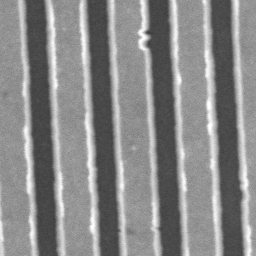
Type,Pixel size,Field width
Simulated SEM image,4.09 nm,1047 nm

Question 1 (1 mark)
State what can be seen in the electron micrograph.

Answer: parallel lines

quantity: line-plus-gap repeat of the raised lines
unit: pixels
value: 61.4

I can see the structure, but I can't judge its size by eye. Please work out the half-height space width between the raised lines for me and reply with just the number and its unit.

100 nanometres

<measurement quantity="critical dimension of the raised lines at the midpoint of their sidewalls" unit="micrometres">0.151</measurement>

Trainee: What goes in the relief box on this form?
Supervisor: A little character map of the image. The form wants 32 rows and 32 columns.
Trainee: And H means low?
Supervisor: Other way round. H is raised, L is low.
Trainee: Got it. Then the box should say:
HHHLLLHHHHHLLLHHHHLLLHHHHHLLLHHH
HHHLLLHHHHHLLLHHHHLLLHHHHHLLLHHH
HHHLLLHHHHHLLLHHHHLLLHHHHHLLLHHH
HHHLLLHHHHHLLLHHHHLLLLHHHHLLLHHH
HHHLLLHHHHHLLLHHHHLLLHHHHHLLLHHH
HHHLLLHHHHHLLLHHHHLLLLHHHHLLLHHH
HHHLLLHHHHHLLLHHHHLLLLHHHHLLLHHH
HHHLLLHHHHHLLLHHHHHLLLHHHHLLLHHH
HHHLLLHHHHHLLLHHHHHLLLHHHHLLLHHH
HHHLLLHHHHHLLLHHHHHLLLHHHHLLLLHH
HHHLLLLHHHHLLLHHHHHLLLHHHHHLLLHH
HHHLLLHHHHHLLLHHHHHLLLHHHHHLLLHH
HHHHLLLHHHHLLLHHHHHLLLHHHHHLLLHH
HHHHLLLHHHHLLLHHHHHLLLHHHHHLLLHH
HHHHLLLHHHHLLLHHHHHLLLHHHHHLLLHH
HHHHLLLHHHHLLLHHHHHLLLHHHHHLLLHH
HHHHLLLHHHHLLLLHHHHLLLHHHHHLLLHH
HHHHLLLHHHHHLLLHHHHLLLHHHHHLLLHH
HHHHLLLHHHHHLLLHHHHLLLHHHHHLLLHH
HHHHLLLHHHHHLLLHHHHLLLHHHHHLLLHH
HHHHLLLHHHHHLLLHHHHLLLLHHHHLLLHH
HHHHLLLHHHHHLLLHHHHLLLHHHHHLLLHH
HHHHLLLHHHHHLLLHHHHLLLLHHHHLLLHH
HHHHLLLHHHHHLLLHHHHLLLLHHHHLLLHH
HHHHLLLHHHHHLLLHHHHHLLLHHHHLLLLH
HHHHLLLHHHHHLLLHHHHHLLLHHHHLLLHH
HHHHLLLHHHHHLLLHHHHHLLLHHHHLLLLH
HHHHLLLHHHHHLLLHHHHHLLLHHHHLLLHH
HHHHLLLHHHHHLLLHHHHHLLLHHHHLLLLH
HHHHLLLHHHHHLLLHHHHHLLLHHHHLLLLH
HHHHLLLHHHHHLLLHHHHHLLLHHHHLLLLH
HHHHLLLLHHHHLLLHHHHHLLLHHHHHLLLH